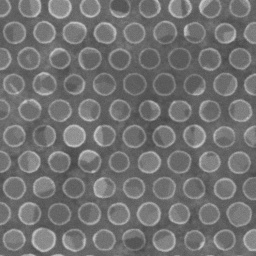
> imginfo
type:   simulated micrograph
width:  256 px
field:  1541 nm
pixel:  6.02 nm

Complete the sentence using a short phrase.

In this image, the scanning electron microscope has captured a regular array of raised bodies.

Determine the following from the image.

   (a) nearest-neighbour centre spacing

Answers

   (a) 178 nm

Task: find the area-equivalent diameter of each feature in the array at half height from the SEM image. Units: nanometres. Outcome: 130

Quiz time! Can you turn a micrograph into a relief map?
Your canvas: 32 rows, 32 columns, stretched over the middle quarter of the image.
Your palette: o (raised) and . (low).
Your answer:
o...ooooo...oooo...oooo....oooo.
................................
.........oo.....................
.ooo....oooo...ooooo...oooo....o
ooooo..oooooo..ooooo...ooooo..oo
ooooo..oooooo..oooooo.oooooo..oo
.oooo...ooooo..ooooo...oooo...oo
.........oo......oo.....oo......
................................
o....ooo.....oo.....oo.....ooo..
oo..ooooo...oooo...ooooo...oooo.
oo..ooooo...ooooo..ooooo..oooooo
oo..ooooo...oooo...ooooo..oooooo
o....ooo....oooo....ooo....oooo.
................................
..o......oo......oo.............
ooooo...oooo...ooooo...oooo...oo
ooooo...ooooo..ooooo..oooooo..oo
ooooo...ooooo..ooooo..oooooo..oo
ooooo...oooo...ooooo...oooo....o
.ooo............ooo.....oo......
................................
....oooo....ooo.....ooo....oooo.
o...ooooo...oooo...ooooo..oooooo
o...ooooo..ooooo...ooooo..oooooo
o...ooooo...oooo...ooooo..ooooo.
o....ooo....ooo....oooo....oooo.
................................
.................o......oo......
ooooo...oooo...ooooo...ooooo..oo
ooooo...ooooo..ooooo..oooooo..oo
ooooo...ooooo..ooooo..oooooo..oo